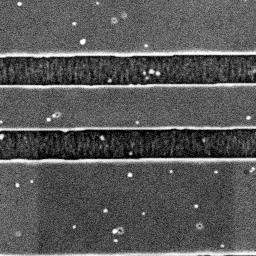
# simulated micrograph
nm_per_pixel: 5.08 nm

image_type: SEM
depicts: lines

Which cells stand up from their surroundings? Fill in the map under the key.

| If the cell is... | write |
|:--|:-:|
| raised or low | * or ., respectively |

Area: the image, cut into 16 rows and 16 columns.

****************
****************
****************
*...............
................
****************
****************
****************
................
................
****************
****************
****************
****************
****************
****************